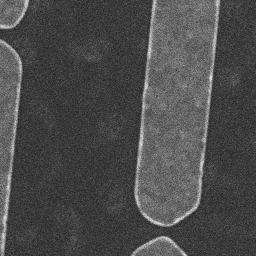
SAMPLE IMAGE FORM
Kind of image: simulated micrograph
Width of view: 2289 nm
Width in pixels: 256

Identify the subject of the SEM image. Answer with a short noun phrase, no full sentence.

one or a few lines or trenches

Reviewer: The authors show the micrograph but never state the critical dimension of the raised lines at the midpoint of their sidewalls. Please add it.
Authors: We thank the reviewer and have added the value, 586 nanometers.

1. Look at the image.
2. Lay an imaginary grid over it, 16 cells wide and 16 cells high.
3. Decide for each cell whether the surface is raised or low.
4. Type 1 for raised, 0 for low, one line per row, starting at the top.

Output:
1100000000111100
1000000001111100
0000000001111000
1000000001111000
1000000001111000
1000000001111000
1000000001111000
1000000001111000
1000000001111000
1000000001111000
1000000001111000
1000000011111000
1000000001110000
0000000001110000
0000000000000000
0000000001100000